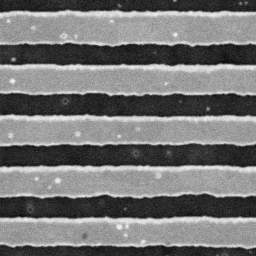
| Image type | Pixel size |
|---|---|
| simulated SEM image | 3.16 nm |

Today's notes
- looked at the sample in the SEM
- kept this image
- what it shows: lines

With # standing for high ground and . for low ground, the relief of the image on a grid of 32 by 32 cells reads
................................
..#.....##...##......###....#...
################################
################################
################################
###.#.##..######.#.###.#####.##.
................................
................................
################################
################################
################################
################################
................................
................................
###...#...##....................
################################
################################
################################
................................
................................
................................
################################
################################
################################
##..###.####..######.......#..#.
................................
................................
################################
################################
################################
################################
................................